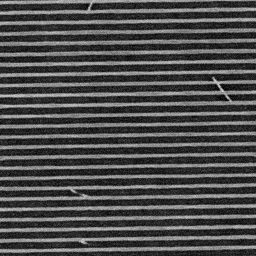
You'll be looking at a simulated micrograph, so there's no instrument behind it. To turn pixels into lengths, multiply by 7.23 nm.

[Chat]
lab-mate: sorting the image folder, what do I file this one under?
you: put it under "parallel lines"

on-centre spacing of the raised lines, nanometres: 74.8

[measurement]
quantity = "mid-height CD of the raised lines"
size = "20.8 nanometres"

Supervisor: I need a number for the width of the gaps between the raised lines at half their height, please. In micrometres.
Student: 0.0542